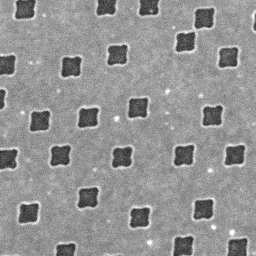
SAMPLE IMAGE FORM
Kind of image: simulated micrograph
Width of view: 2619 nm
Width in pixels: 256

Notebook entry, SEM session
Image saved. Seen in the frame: a regular array of holes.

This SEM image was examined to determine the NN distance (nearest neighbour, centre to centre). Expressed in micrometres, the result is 0.488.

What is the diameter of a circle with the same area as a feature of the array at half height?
0.227 microns